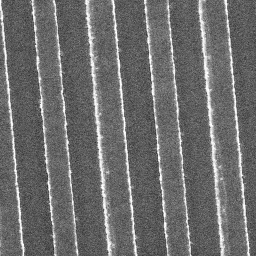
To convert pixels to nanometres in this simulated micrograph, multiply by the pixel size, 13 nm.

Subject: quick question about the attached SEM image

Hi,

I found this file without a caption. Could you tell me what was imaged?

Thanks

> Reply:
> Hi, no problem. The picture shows lines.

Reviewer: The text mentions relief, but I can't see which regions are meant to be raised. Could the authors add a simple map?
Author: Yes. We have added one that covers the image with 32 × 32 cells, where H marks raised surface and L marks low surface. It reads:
LLLLHHHLLLLHHHLLLLHHHLLLLHHHLLLL
LLLLHHHLLLLHHHLLLLHHHLLLLHHHLLLL
LLLLHHHLLLLHHHLLLLHHHLLLLHHHLLLL
LLLLHHHLLLLHHHHLLLHHHLLLLHHHHLLL
LLLLHHHLLLLHHHHLLLLHHLLLLHHHHLLL
HLLLLHHLLLLHHHHLLLLHHHLLLLHHHLLL
HLLLLHHLLLLHHHHLLLLHHHLLLLHHHLLL
HLLLLHHLLLLHHHHLLLLHHHLLLLHHHLLL
HLLLLHHHLLLLHHHLLLLHHHLLLLHHHLLL
HLLLLHHHLLLLHHHLLLLHHHLLLLHHHLLL
HLLLLHHHLLLLHHHLLLLHHHLLLLHHHLLL
HLLLLHHHLLLLHHHLLLLHHHLLLLHHHLLL
HLLLLHHHLLLLHHHLLLLHHHLLLLHHHLLL
HLLLLHHHLLLLHHHLLLLHHHLLLLHHHLLL
HLLLLHHHLLLLHHHHLLLHHHLLLLHHHHLL
HLLLLHHHLLLLHHHHLLLLHHLLLLHHHHLL
HHLLLHHHLLLLHHHHLLLLHHHLLLHHHHLL
HHLLLLHHLLLLHHHHLLLLHHHLLLLHHHLL
HHLLLLHHLLLLHHHHLLLLHHHLLLLHHHLL
HHLLLLHHHLLLLHHHLLLLHHHLLLLHHHLL
HHLLLLHHHLLLLHHHLLLLHHHLLLLHHHLL
HHLLLLHHHLLLLHHHLLLLHHHLLLLHHHLL
HHLLLLHHHLLLLHHHLLLLHHHLLLLHHHLL
HHLLLLHHHLLLLHHHLLLLHHHLLLLHHHLL
HHLLLLHHHLLLLHHHLLLLHHHLLLLHHHLL
HHLLLLHHHLLLLHHHHLLLHHHLLLLHHHHL
HHLLLLHHHLLLLHHHHLLLLHHLLLLHHHHL
HHHLLLHHHLLLLHHHHLLLLHHLLLLLHHHL
HHHLLLLHHLLLLHHHHLLLLHHHLLLLHHHL
HHHLLLLHHLLLLHHHHLLLLHHHLLLLHHHL
HHHLLLLHHHLLLLHHHLLLLHHHLLLLHHHL
HHHLLLLHHHLLLLHHHLLLLHHHLLLLHHHL